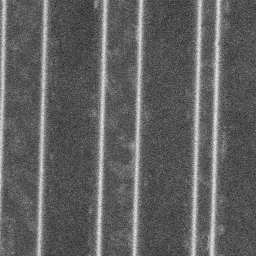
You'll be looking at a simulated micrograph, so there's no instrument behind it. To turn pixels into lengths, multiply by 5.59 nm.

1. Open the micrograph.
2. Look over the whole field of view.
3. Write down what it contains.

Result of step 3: one or a few lines or trenches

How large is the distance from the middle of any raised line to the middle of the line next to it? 500 nm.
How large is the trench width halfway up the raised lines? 331 nm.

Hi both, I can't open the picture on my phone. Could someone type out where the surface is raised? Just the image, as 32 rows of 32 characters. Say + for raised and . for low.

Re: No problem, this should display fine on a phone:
.+++++.......+++++.......++.....
.+++++.......+++++.......++.....
.+++++.......+++++.......++.....
++++++.......++++........++.....
++++++.......++++........++.....
++++++.......++++........++.....
++++++.......++++........++.....
++++++.......++++........++.....
+++++........++++........++.....
+++++........++++........++.....
+++++........++++........++.....
+++++........++++........++.....
+++++........++++........++.....
+++++........++++........++.....
+++++........++++........++.....
+++++........++++........++.....
+++++........++++........++.....
+++++........++++........++.....
+++++........++++.......+++.....
+++++........++++.......+++.....
+++++........++++........++.....
+++++........++++........++.....
+++++........++++........++.....
+++++........++++.......+++.....
+++++........++++.......+++.....
+++++........++++.......+++.....
+++++........++++.......+++.....
+++++.......+++++.......+++.....
+++++.......+++++.......+++.....
+++++.......+++++.......+++.....
+++++.......+++++.......++......
+++++.......+++++.......++......